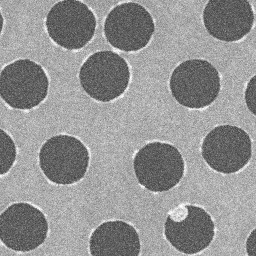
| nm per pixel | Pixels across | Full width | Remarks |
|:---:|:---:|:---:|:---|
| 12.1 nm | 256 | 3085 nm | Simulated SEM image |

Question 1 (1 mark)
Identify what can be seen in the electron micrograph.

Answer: holes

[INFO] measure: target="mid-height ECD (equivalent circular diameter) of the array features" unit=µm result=0.611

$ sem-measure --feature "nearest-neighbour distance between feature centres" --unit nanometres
847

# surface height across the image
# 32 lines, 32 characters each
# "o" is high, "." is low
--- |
ooooooo....oooo..ooooooooo.....o
oooooo......oo.....oooooo.......
oooooo......o......oooooo.......
oooooo......o......ooooooo.....o
oooooo......o......oooooooo....o
ooooooo....ooo....oooooooooooooo
oooooooooooo..oooooooooooooooooo
oo..ooooooo.....oooooooo..oooooo
.....ooooo......oooooo.....ooooo
......oooo......ooooo......ooooo
......oooo......ooooo.......ooo.
......ooooo....oooooo......oooo.
.....ooooooo..oooooooo.....oooo.
oo..oooooooooooooooooooo.oooooo.
oooooooooooooooooooooooooooooooo
oooooooooooooooooooooooooooooooo
.ooooooooooooooooooooooooo.....o
..oooo....ooooooooooooooo......o
..ooo......ooooooo....ooo.......
..ooo......oooooo......oo......o
..ooo......oooooo......ooo.....o
.oooo......oooooo......oooo...oo
oooooo....ooooooo......ooooooooo
oooooooooooooooooo....oooooooooo
oooooooooooooooooooooooooooooooo
oo..oooooooooooooooooooooooooooo
.....oooooooooooooooooo...oooooo
......ooooooooooooooo......ooooo
......oooooo.....oooo......ooooo
......ooooo......oooo......oooo.
.....oooooo.......ooo.....ooooo.
ooooooooooo......oooooo..oooooo.